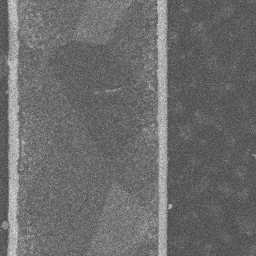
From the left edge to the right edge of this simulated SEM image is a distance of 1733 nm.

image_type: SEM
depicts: one or a few lines or trenches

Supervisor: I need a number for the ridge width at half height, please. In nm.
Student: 1010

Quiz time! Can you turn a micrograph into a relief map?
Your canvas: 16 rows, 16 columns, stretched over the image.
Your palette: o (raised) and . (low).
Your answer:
.ooooooooo......
.ooooooooo......
.ooooooooo......
.ooooooooo......
.ooooooooo......
.ooooooooo......
.ooooooooo......
.ooooooooo......
.ooooooooo......
.ooooooooo......
.ooooooooo......
.ooooooooo......
.ooooooooo......
.ooooooooo......
.ooooooooo......
.ooooooooo......